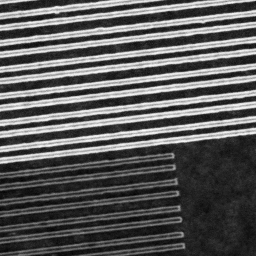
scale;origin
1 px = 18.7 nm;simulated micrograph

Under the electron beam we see parallel lines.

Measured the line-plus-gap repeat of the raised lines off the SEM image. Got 246 nm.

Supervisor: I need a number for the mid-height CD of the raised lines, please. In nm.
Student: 88.1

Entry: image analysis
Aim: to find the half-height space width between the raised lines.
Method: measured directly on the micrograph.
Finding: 141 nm